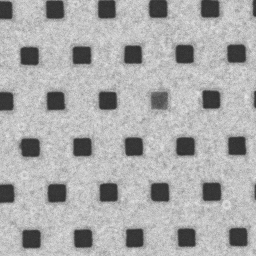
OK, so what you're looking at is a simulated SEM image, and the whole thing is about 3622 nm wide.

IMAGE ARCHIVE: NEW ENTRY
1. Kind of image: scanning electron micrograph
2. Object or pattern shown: a regular array of holes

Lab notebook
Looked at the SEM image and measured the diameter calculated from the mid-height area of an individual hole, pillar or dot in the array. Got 293 nm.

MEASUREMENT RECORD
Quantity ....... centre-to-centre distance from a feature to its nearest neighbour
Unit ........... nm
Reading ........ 731